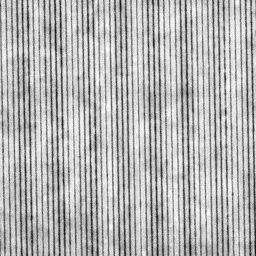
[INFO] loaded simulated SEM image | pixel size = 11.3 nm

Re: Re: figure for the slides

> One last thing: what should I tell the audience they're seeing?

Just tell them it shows parallel lines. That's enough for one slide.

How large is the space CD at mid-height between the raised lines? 0.0198 µm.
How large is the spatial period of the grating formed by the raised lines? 0.0616 microns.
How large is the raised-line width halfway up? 39.5 nm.